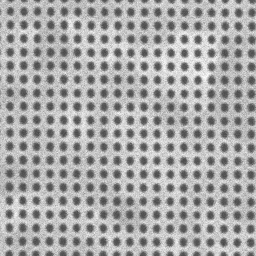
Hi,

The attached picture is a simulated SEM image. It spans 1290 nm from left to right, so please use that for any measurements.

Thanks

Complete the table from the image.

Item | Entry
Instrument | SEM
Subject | a regular array of holes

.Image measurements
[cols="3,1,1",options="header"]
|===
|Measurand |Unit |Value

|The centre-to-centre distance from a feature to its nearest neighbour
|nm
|66.3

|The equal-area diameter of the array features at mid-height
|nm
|44.4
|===